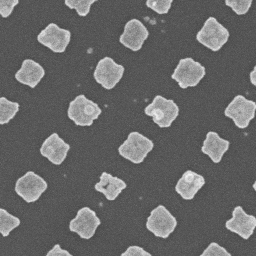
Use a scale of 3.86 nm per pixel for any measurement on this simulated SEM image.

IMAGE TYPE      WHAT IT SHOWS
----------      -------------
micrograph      a regular array of raised bodies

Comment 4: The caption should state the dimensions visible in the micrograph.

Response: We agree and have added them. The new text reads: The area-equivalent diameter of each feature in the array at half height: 107 nm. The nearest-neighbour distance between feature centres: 45.1 pixels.